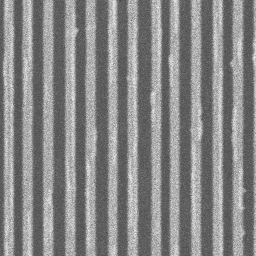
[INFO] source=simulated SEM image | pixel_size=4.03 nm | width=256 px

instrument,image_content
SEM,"parallel lines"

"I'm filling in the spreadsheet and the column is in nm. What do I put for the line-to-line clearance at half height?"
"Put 44.3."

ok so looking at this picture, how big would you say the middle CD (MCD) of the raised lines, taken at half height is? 40.8 nm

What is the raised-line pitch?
83.8 nanometers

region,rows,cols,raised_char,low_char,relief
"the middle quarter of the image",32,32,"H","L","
LHHLLLHHLLLHHLLLHHLLLLHHLLHHHLLL
LHHLLLHHLLLHHLLLHHLLLLHHLLLHHLLL
LHHLLLHHLLLHHLLLHHLLLLHHLLLHHLLL
LHHLLHHHLLLHHLLLHHLLLLHHLLLHHLLL
LHHLLHHHLLLHHLLLHHLLLLHHLLLHHLLL
LHHLLHHHLLLHHLLLHHLLLLHHLLLHHLLL
LHHLLLHHLLLHHLLLHHLLLLHHLLLHHLLL
LHHLLLHHLLLHHLLLHHLLLLHHLLLHHLLL
LHHLLLHHLLLHHLLLHHLLLLHHLLLHHLLL
LHHLLLHHLLLHHLLLHHLLLLHHLLLHHLLL
LHHLLLHHLLLHHLLLHHLLLLHHLLLHHLLL
LHHLLLHHLLLHHLLLHHLLLLHHLLLHHLLL
LHHLLLHHLLLHHLLLHHLLLLHHLLLHHLLL
LHHLLLHHLLLHHLLLHHLLLLHHLLLHHLLL
LHHLLLHHLLLHHLLLHHLLLLHHLLLHHLLL
LHHLLLHHLLLHHLLLHHLLLLHHLLLHHLLL
LHHLLLHHLLLHHLLLHHLLLLHHLLLHHLLL
LHHLLLHHLLLHHLLLHHLLLLHHLLLHHLLL
LHHLLLHHLLLHHLLLHHLLLLHHLLLHHLLL
LHHLLLHHLLLHHLLLHHLLLLHHLLLHHLLL
LHHLLLHHLLLHHLLLHHLLLLHHLLLHHLLL
LHHLLLHHLLLHHLLLHHLLLLHHLLLHHLLL
LHHLLLHHLLLHHLLLHHLLLLHHLLLHHLLL
LHHLLLHHLLLHHLLLHHLLLLHHLLLHHLLL
LHHLLLHHLLLHHLLLHHLLLLHHLLLHHLLL
LHHLLLHHLLLHHLLLHHLLLLHHLLLHHLLL
LHHLLLHHLLLHHLLLHHLLLLHHLLLHHLLL
LHHLLLHHLLLHHLLLHHLLLLHHLLLHHLLL
LHHLLLHHLLLHHLLLHHLLLLHHLLLHHLLL
LHHLLLHHLLLHHLLLHHLLLLHHLLLHHLLL
LHHLLLHHLLLHHLLLHHLLLLHHLLLHHLLL
LHHLLLHHLLLHHLLLHHLLLLHHLLLHHLLL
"